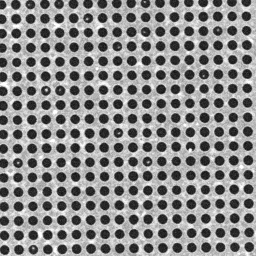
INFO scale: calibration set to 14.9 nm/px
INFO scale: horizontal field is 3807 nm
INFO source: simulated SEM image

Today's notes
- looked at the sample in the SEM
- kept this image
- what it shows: a regular array of holes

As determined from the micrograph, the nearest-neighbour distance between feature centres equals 212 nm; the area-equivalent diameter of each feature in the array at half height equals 155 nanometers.